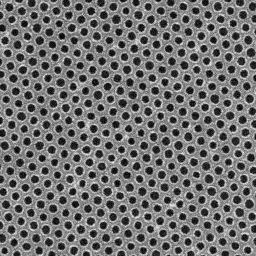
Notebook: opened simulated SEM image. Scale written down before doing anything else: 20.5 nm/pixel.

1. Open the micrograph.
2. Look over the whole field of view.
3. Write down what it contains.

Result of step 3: a regular array of holes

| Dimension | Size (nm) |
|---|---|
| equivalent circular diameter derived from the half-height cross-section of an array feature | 184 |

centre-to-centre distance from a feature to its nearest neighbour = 261 nm